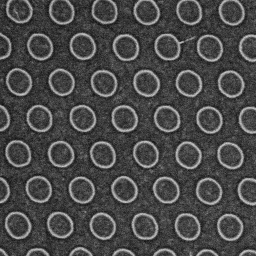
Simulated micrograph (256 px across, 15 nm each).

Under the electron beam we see a regular array of raised bodies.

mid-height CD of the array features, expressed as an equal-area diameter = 0.374 um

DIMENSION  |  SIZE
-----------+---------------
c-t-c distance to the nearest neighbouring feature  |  618 nanometres